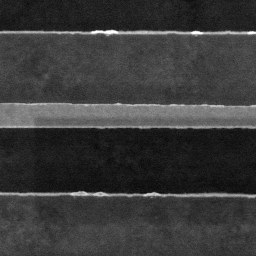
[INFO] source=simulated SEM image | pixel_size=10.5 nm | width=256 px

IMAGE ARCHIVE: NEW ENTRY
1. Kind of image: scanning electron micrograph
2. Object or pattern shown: lines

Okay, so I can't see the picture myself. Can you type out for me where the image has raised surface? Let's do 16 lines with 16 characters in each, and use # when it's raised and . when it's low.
................
................
################
################
################
################
################
################
................
................
................
................
################
################
################
################